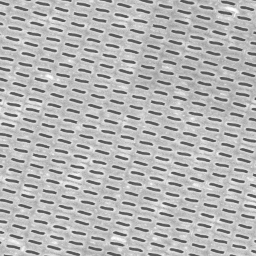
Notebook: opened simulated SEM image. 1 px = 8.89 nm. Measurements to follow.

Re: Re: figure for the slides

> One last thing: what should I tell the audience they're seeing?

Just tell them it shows a regular array of holes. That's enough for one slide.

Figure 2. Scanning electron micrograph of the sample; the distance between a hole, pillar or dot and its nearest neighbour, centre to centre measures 92.6 nanometers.